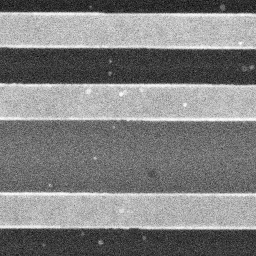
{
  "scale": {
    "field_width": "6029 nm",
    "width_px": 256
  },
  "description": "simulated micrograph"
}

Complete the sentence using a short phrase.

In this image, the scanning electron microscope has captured lines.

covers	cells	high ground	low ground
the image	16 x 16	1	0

0000000000000000
1111111111111111
1111111111111111
0000000000000000
0000000000000000
1111111111111111
1111111111111111
0000000000000000
0000000000000000
0000000000000000
0000000000000000
0000000000000000
1111111111111111
1111111111111111
0000000000000000
0000000000000000